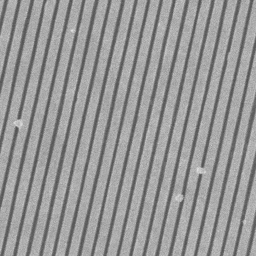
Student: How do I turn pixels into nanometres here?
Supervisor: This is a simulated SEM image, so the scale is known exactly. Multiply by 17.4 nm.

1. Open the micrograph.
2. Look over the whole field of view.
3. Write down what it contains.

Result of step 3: parallel lines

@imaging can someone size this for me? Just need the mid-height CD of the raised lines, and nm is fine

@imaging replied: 153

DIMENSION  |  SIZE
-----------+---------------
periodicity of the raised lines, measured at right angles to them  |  0.22 micrometres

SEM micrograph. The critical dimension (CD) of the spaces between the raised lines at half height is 61.5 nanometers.